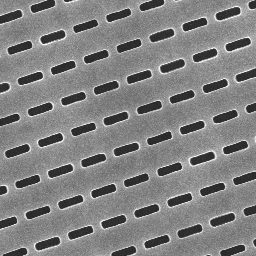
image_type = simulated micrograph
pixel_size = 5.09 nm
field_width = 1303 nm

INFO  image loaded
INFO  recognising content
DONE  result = a regular array of holes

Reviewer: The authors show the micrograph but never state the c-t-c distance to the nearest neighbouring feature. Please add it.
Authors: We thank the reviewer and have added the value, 164 nm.